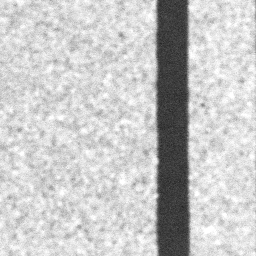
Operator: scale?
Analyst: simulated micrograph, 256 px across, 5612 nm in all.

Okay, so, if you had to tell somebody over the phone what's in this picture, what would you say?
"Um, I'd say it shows one or a few lines or trenches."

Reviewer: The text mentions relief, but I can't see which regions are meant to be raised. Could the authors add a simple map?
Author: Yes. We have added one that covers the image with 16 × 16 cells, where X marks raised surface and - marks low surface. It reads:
XXXXXXXXXX--XXXX
XXXXXXXXXX--XXXX
XXXXXXXXXX--XXXX
XXXXXXXXXX--XXXX
XXXXXXXXXX--XXXX
XXXXXXXXXX--XXXX
XXXXXXXXXX--XXXX
XXXXXXXXXX--XXXX
XXXXXXXXXX--XXXX
XXXXXXXXXX--XXXX
XXXXXXXXXX--XXXX
XXXXXXXXXX--XXXX
XXXXXXXXXX--XXXX
XXXXXXXXXX--XXXX
XXXXXXXXXX--XXXX
XXXXXXXXXX--XXXX